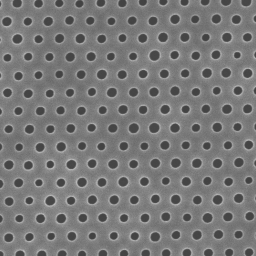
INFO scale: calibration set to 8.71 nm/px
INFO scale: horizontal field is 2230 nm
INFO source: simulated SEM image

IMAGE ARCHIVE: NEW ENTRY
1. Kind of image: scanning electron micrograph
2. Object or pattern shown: a regular array of holes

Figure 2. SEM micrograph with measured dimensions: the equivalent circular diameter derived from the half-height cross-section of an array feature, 8.74 px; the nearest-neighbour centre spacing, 174 nm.